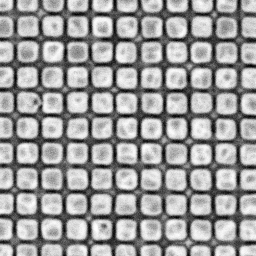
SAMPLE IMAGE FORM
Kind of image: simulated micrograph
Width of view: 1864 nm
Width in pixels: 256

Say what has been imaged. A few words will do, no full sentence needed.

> a regular array of raised bodies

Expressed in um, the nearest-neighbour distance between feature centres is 0.178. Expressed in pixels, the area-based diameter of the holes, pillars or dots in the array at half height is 21.5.